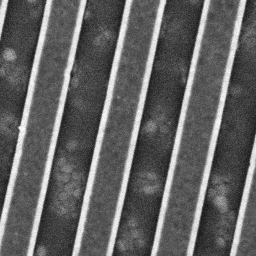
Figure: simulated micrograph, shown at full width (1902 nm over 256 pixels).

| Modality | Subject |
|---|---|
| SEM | one or a few lines or trenches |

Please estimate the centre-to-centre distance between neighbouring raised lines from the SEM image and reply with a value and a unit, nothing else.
577 nanometres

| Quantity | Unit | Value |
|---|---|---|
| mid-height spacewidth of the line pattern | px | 42.8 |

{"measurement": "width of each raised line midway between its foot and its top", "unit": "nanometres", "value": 254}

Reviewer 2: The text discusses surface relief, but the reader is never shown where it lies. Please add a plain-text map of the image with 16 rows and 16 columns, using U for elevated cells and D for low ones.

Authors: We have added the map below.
DDDUUDDDUUDDDUUD
DDDUUDDDUUDDDUUD
DDDUUDDDUUDDUUUD
DDUUUDDUUDDDUUDD
DDUUDDDUUDDDUUDD
DDUUDDDUUDDDUUDD
DDUUDDDUUDDDUUDD
DDUUDDUUUDDUUUDD
DUUDDDUUDDDUUDDD
DUUDDDUUDDDUUDDD
DUUDDDUUDDDUUDDD
DUUDDDUUDDDUUDDD
UUUDDUUUDDUUUDDU
UUDDDUUDDDUUDDDU
UUDDDUUDDDUUDDDU
UUDDDUUDDDUUDDDU